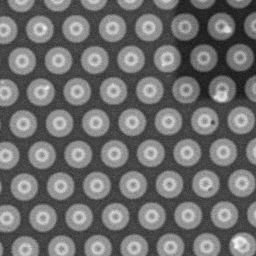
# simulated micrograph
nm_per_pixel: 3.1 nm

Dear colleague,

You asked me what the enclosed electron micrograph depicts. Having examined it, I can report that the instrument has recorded an array of small figures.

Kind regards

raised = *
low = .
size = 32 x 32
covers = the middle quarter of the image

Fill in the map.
**...******...******...******...
*....*****.....****.....****....
................................
...........**.......***......***
.*****....*****....*****....****
******...*******..*******..*****
*******..*******..*******..*****
*******..*******..*******..*****
******...******....*****....****
.*****....****......***......***
................................
.......**......***......****....
*....*****....******...******...
**...******...******...******...
**...******...******...******...
**...******...******...******...
**...******...******...******...
*.....****.....****......**.....
................................
..***......***......****.....***
.*****....*****....******...****
*******..*******..*******...****
*******..*******..*******..*****
*******..*******..*******...****
.*****....*****....*****....****
..***......***......***.......**
................................
*.....****.....****.....*****...
**...******...******...******...
**...*******..*******..*******..
**...*******..*******..*******..
**...******...******...******...